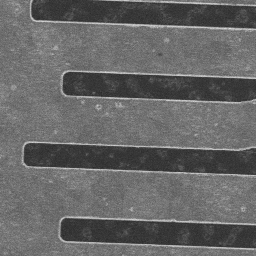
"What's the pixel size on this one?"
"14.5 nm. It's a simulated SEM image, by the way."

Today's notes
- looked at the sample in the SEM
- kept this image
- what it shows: one or a few lines or trenches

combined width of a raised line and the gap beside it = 1.06 micrometres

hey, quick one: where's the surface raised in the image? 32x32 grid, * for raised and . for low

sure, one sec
****........................****
****............................
****............................
***************************.....
********************************
********************************
********************************
********************************
********************************
********..................******
********........................
********........................
********************............
********************************
********************************
********************************
********************************
********************************
***...................**********
***.............................
***.............................
******************..............
********************************
********************************
********************************
********************************
********************************
********..........**************
*******.........................
********........................
**************..................
********************************